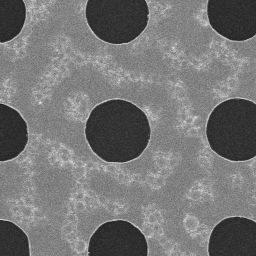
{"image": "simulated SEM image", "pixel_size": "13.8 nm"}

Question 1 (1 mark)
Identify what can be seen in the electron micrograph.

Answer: holes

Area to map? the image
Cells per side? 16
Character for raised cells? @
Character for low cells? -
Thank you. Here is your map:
--@@@----@@@@---
-@@@@@---@@@@---
-@@@@@--@@@@@@@@
@@@@@@@@@@@@@@@@
@@@@@@@@@@@@@@@@
@@@@@@@@@@@@@@@@
@@@@@@--@@@@@@--
-@@@@----@@@@---
--@@@----@@@@---
-@@@@@---@@@@---
@@@@@@@@@@@@@@@@
@@@@@@@@@@@@@@@@
@@@@@@@@@@@@@@@@
@@@@@@@@@@@@@@@@
-@@@@@---@@@@---
--@@@@---@@@@---